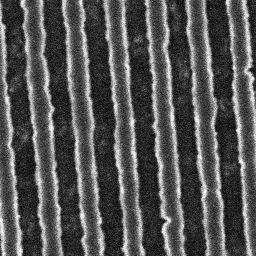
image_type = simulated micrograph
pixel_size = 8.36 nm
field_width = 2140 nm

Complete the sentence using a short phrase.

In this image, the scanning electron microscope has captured parallel lines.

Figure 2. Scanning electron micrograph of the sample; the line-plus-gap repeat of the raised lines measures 341 nm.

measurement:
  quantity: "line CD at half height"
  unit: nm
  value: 158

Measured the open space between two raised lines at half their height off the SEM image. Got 179 nanometers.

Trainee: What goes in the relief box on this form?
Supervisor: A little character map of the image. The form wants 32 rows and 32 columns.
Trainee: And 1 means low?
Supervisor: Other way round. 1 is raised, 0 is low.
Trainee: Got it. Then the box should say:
00011000110001100011100111001110
00011000111001110011100111001110
00011000111001110011100011000110
00011000110001110011100111000110
10011100111001110001100111000110
10011100111000110001100011000110
10011000111000110001100011000110
10011100011000110001100011000110
10011100011000110001100011000110
10011100111000110001100011100111
10011100011000110001100011100111
10001100011000110001100011100111
10001100011000110001100011100111
10001110011000111001110011100111
10001100011100111001110011100111
10001110011100011001110001100011
11001110011100111001110001100011
10001110011100111001110001100011
10001110011100111000110001100011
11001110001100011001110001100011
11000110001100011000110001100011
11000110001100011000110001100011
11000110001100011000110001100011
11000110001100011000110001100011
11000110001100011000111001110011
11000110001100011000111001110011
11000111001100011000111000110011
11000110001110011100011000110001
11000110000100001100111000110001
11100111001110001100111000110001
11100111001110001100011000110001
11100111000110001100011000110001